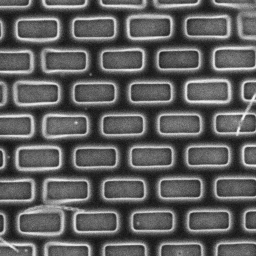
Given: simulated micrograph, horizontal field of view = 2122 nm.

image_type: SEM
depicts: groups of lines, slits or small figures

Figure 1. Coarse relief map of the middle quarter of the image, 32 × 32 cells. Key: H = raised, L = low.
LLLLLHHHHHLLLLLLLLLHHHHHLLLLLLLL
LLLLHHHHHHHHHHHLHHHHHHHHHHHHHHHH
HHHHHHHHHHHHHHHHHHHHHHHHHHHHHHHH
HHHHHHHHHHHHHHHHHHHHHHHHHHHHHHHH
HHHHHHHHHHHHHHHHHHHHHHHHHHHHHHHH
HHHLLLLLLLLLLHHHHLLLLLLLLLLHHHHL
HHLLLLLLLLLLLHHHHLLLLLLLLLLHHHHL
HHLLLLLLLLLLLHHHHLLLLLLLLLLHHHHL
HHHLLLLLLLLLLHHHHLLLLLLLLLLHHHHL
HHHHLLLLLHHHHHHHHHHHHHHHHHHHHHHH
HHHHHHHHHHHHHHHHHHHHHHHHHHHHHHHH
HHHHHHHHHHHHHHHHHHHHHHHHHHHHHHHH
HHHHHHHHHHHHHHHHHHHHHHHHHHHHHHHH
LLLLLHHHHHLLLLLLLLLLHHHHLLLLLLLL
LLLLLLHHHHLLLLLLLLLLHHHHLLLLLLLL
LLLLLLHHHLLLLLLLLLLLHHHHLLLLLLLL
LLLLLLHHHHLLLLLLLLLLHHHHLLLLLLLL
LLLLLHHHHHLLLLLLLLLHHHHHHLLLLLLL
HHHHHHHHHHHHHHHHHHHHHHHHHHHHHHHH
HHHHHHHHHHHHHHHHHHHHHHHHHHHHHHHH
HHHHHHHHHHHHHHHHHHHHHHHHHHHHHHHH
HHHLLLLLLLLLLHHHHLLLLLLLLLLHHHHL
HHHLLLLLLLLLLHHHHLLLLLLLLLLHHHHL
HHHLLLLLLLLLLHHHHLLLLLLLLLLHHHHL
HHHLLLLLLLLLLHHHHLLLLLLLLLLHHHHL
HHHLLLLLLLLLHHHHHHLLLLLLLLHHHHHH
HHHHHHHHHHHHHHHHHHHHHHHHHHHHHHHH
HHHHHHHHHHHHHHHHHHHHHHHHHHHHHHHH
HHHHHHHHHHHHHHHHHHHHHHHHHHHHHHHH
LLLLLLHHHHLLLLLLLLLLHHHHLLLLLLLL
LLLLLLHHHHLLLLLLLLLLHHHHLLLLLLLL
LLLLLLHHHHLLLLLLLLLLHHHHLLLLLLLL